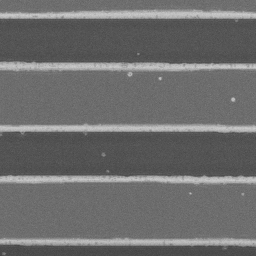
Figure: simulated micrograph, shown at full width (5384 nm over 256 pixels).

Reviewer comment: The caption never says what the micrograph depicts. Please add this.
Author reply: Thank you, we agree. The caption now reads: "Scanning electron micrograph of lines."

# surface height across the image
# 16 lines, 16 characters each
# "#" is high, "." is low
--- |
################
................
................
................
################
################
################
################
................
................
................
################
################
################
################
................